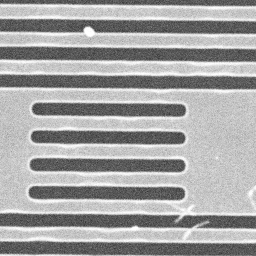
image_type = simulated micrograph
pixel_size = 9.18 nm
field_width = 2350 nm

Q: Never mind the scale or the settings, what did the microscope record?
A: groups of lines, slits or small figures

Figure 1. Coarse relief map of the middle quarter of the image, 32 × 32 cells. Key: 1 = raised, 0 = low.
11111111111111111111111111111111
11111111111111111111111111111111
00000000111111100000011110001111
00000000000000000000000000000000
00000000000000000000000000000000
00000000000000000000000000000000
11111111111111111111100000011000
11111111111111111111111111111111
11111111111111111111111111111111
00000000000000000000100001111111
00000000000000000000000000000001
00000000000000000000000000000001
00000000000000000000000000000001
11111111111111000011111111111111
11111111111111111111111111111111
11111111111111111111111111111111
00011111111111111111111111111111
00000000000000000000000000000011
00000000000000000000000000000001
00000000000000000000000000000011
10111111111111111111111111111111
11111111111111111111111111111111
11111111111111111111111111111111
00000000011111110111111111111111
00000000000000000000000000000001
00000000000000000000000000000001
00000000000000000000000000000011
11111101111111111111111111111111
11111111111111111111111111111111
11111111111111111111111111111111
00000000000000000000011000001111
00000000000000000000000000000011